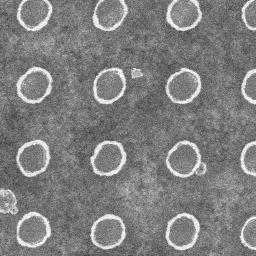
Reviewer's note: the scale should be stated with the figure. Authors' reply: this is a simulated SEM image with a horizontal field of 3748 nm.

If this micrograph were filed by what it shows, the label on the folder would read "a regular array of raised bodies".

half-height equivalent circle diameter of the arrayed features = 473 nm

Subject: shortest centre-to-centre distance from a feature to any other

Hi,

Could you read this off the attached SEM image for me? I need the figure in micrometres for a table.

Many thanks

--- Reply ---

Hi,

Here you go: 1.06